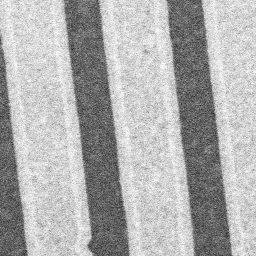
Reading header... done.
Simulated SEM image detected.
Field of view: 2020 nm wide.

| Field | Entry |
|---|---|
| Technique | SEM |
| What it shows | one or a few lines or trenches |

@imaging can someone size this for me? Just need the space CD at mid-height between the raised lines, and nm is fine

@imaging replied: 386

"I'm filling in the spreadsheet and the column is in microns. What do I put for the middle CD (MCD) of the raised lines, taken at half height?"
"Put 0.413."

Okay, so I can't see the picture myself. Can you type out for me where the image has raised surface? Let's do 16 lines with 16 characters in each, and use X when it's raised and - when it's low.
XXXX---XXX---XXX
XXXX---XXX---XXX
-XXX---XXX---XXX
-XXX---XXX---XXX
-XXX---XXXX--XXX
-XXX---XXXX---XX
-XXX---XXXX---XX
-XXX----XXX---XX
-XXXX---XXX---XX
-XXXX---XXX---XX
--XXX---XXX---XX
--XXX---XXX---XX
--XXX---XXX----X
--XXX---XXX----X
--XXX---XXXX---X
--XXX---XXXX---X